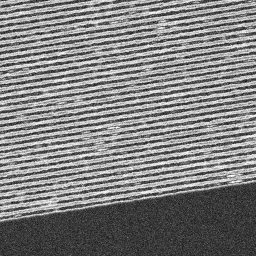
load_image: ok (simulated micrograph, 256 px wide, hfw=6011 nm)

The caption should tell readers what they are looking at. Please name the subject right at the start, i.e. parallel lines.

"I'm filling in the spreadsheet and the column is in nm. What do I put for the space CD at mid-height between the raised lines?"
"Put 90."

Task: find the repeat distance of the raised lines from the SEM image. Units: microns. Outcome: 0.153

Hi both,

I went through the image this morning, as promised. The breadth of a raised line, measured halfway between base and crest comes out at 66.7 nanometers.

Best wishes